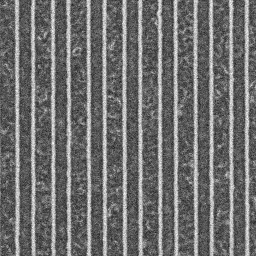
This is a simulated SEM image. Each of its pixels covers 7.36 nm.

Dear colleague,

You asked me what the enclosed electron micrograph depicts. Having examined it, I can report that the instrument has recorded parallel lines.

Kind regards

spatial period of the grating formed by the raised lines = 262 nm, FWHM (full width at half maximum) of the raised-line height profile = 149 nanometres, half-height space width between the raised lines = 113 nm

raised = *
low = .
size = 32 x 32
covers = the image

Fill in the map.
**..***..**..**...**..**..***..*
**..***..**..***..**..**..***..*
**..***..**..***..**..**..***..*
**..***..**..***..**..**..***..*
**..***..**..***..**..**..***..*
**..***..**..***..**..**..***..*
**..***..**..***..**..**..***..*
**..***..**..***..**..**..***..*
**..***..**..***..**..**..***..*
**..***..**..***..**..**..***..*
**..***..**..***..**..**..***..*
**..***..**..***..**..**..***..*
**..***..**..***..**..**..***..*
**..***..**..***..**..**..***..*
**..***..**..***..**..**..***..*
**..***..**..***..**..**..***..*
**..***..**..***..**..**..***..*
**..***..**..***..**..**..***..*
**..***..**..***.***..**..***..*
**..***..**..***.***..**..***..*
**..***..**..***..**..**..***..*
**..***..**..***..**..**..***..*
**..***..**..***..**..**...**..*
**..***..**..***..**..**...**..*
**..***..**..***..**..**...**..*
**..***..**..***..**..**...**..*
**..***..**..***..**..**...**..*
**..***..**..***..**..**...**..*
**..***..**..***..**..***.***..*
**..***..**..***..**..**...**..*
**..***..**..***..**..**..***..*
**..***..**..***..**..**...**..*